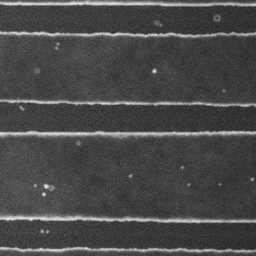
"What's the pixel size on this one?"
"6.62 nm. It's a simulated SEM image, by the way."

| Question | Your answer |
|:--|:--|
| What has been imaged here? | lines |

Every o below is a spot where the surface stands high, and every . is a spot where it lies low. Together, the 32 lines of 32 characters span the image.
ooooooooo.o.o.oooooooooooooooooo
................................
................................
................................
oooooooooooooooooooooooooooooooo
oooooooooooooooooooooooooooooooo
oooooooooooooooooooooooooooooooo
oooooooooooooooooooooooooooooooo
oooooooooooooooooooooooooooooooo
oooooooooooooooooooooooooooooooo
oooooooooooooooooooooooooooooooo
oooooooooooooooooooooooooooooooo
oooooooooooooooooooooooooooooooo
................................
................................
................................
................................
oooooooooooooooooooooooooooooooo
oooooooooooooooooooooooooooooooo
oooooooooooooooooooooooooooooooo
oooooooooooooooooooooooooooooooo
oooooooooooooooooooooooooooooooo
oooooooooooooooooooooooooooooooo
oooooooooooooooooooooooooooooooo
oooooooooooooooooooooooooooooooo
oooooooooooooooooooooooooooooooo
oooooooooooooooooooooooooooooooo
...............o.ooooooooooooooo
................................
................................
................................
oooooooooooooooooooooooooooooooo